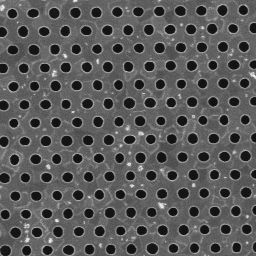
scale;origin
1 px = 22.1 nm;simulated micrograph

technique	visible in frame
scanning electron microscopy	a regular array of holes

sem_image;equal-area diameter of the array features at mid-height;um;0.218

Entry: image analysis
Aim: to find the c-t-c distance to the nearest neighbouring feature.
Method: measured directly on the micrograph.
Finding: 459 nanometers